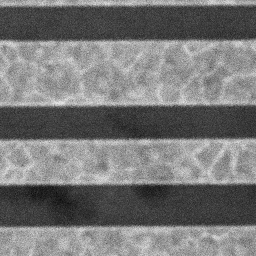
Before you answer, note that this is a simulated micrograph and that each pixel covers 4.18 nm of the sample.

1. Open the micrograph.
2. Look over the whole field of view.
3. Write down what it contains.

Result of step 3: one or a few lines or trenches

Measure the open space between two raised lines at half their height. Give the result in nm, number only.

157